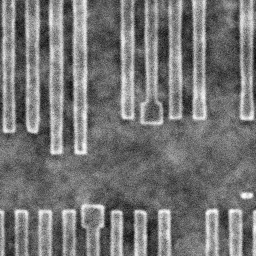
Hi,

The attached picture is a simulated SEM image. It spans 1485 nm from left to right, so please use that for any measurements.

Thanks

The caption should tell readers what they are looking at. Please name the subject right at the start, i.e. wiring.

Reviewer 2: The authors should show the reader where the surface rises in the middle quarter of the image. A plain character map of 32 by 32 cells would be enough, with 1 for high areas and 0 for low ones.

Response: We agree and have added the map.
00011100000000011000011000011000
00011100000000011000011000011000
00011100000000011000011000011000
00011100000000011000011000011000
00011100000000011000011000011000
00011100000000011000011000011000
00011000000000011000011000011000
00011000000000011000011000011000
00011000000000011000011000011000
00011000000000011000111000011000
00011100000000011001111100011000
00011100000000011001111100011000
00011100000000011001111100011000
00011100000000011001111100011000
00011100000000000001111100000000
00011100000000000000000000000000
00011000000000000000000000000000
00011000000000000000000000000000
00011000000000000000000000000000
00011000000000000000000000000000
00011000000000000000000000000000
00011000000000000000000000000000
00000000000000000000000000000000
00000000000000000000000000000000
00000000000000000000000000000000
00000000000000000000000000000000
00000000000000000000000000000000
00000000000000000000000000000000
00000000000000000000000000000000
00000000000000000000000000000000
00000000000000000000000000000000
00000000000000000000000000000000